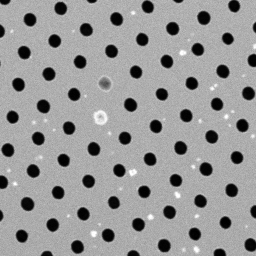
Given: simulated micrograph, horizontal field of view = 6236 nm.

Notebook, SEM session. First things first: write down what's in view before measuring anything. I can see a regular array of holes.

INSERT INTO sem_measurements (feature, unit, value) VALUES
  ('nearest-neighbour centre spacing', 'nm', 790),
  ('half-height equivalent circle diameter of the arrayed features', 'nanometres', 324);